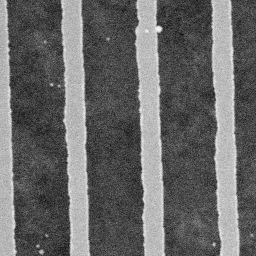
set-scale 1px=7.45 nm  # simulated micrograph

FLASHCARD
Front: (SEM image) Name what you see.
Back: lines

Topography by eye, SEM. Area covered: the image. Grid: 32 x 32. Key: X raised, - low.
X-------XX-------XX--------XX---
X-------XX-------XX--------XX---
X-------XX-------XX--------XX---
X-------XX-------XXX-------XX---
X-------XX-------XXX-------XX---
X-------XX-------XXX-------XX---
X-------XX-------XXX-------XX---
X-------XX-------XXX-------XX---
X-------XX-------XXX-------XX---
X-------XX-------XXX-------XX---
X-------XX-------XXX-------XX---
X-------XX-------XXX-------XX---
X-------XXX-------XX-------XX---
X-------XXX-------XX-------XX---
X-------XXX-------XX-------XX---
X-------XXX-------XX-------XX---
X-------XXX-------XX-------XX---
X-------XXX-------XX-------XX---
X-------XXX-------XX-------XX---
X--------XX-------XX-------XX---
X--------XX-------XX-------XX---
XX-------XX-------XX-------XX---
XX-------XX-------XX-------XX---
XX-------XX-------XX-------XX---
XX-------XX-------XX-------XXX--
XX-------XX-------XX-------XXX--
XX-------XX-------XX-------XXX--
XX-------XX-------XX-------XXX--
XX-------XX-------XX-------XXX--
XX-------XX-------XX-------XXX--
XX-------XX-------XX--------XX--
XX-------XX-------XXX-------XX--